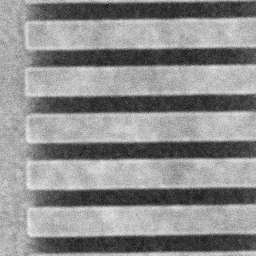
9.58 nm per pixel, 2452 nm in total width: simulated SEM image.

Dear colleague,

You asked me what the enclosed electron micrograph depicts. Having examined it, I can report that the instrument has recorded groups of lines, slits or small figures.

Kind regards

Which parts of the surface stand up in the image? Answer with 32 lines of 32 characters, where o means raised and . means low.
................................
................................
.......................oo..ooooo
...ooooooooooooooooooooooooooooo
...ooooooooooooooooooooooooooooo
...ooooooooooooooooooooooooooooo
................................
................................
....oooooooooooooooooooooooooooo
...ooooooooooooooooooooooooooooo
...ooooooooooooooooooooooooooooo
...ooooooooooooooooooooooooooooo
................................
................................
....oooooooooooooooooooooooooooo
...ooooooooooooooooooooooooooooo
...ooooooooooooooooooooooooooooo
...ooooooooooooooooooooooo......
................................
................................
....oooooooooooooooooooooooooooo
...ooooooooooooooooooooooooooooo
...ooooooooooooooooooooooooooooo
....ooooooooooo.................
................................
................................
...ooooooooooooooooooooooooooooo
...ooooooooooooooooooooooooooooo
...ooooooooooooooooooooooooooooo
....oooooo......................
................................
..............................oo